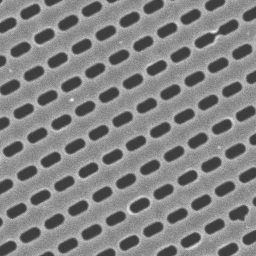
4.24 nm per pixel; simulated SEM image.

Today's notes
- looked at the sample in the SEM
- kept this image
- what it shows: a regular array of holes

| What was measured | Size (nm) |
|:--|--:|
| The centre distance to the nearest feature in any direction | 116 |